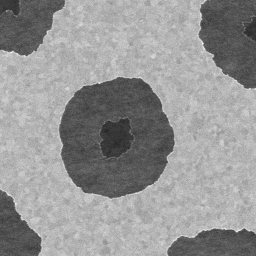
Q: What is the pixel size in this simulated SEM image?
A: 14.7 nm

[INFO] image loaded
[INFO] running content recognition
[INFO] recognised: ring-shaped grooves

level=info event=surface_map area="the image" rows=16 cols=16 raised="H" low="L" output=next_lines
HLLLHHHHHHHHHLLL
LLLHHHHHHHHHHLLH
LLLHHHHHHHHHHLLL
HHHHHHHHHHHHHLLL
HHHHHHHHHHHHHHLL
HHHHHLLLLHHHHHHL
HHHHLLLLLLHHHHHH
HHHHLLLHLLLHHHHH
HHHHLLHHLLLHHHHH
HHHHLLHHLLLHHHHH
HHHHLLLLLLHHHHHH
HHHHHLLLLLHHHHHH
LHHHHHHHHHHHHHHH
LHHHHHHHHHHHHHHH
LLHHHHHHHHHHHLLL
LLLHHHHHHHHLLLLL